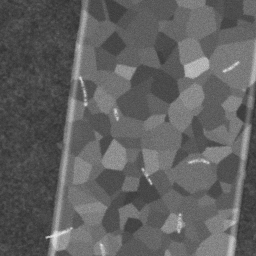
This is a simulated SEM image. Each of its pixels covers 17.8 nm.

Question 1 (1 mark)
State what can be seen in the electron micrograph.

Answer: one or a few lines or trenches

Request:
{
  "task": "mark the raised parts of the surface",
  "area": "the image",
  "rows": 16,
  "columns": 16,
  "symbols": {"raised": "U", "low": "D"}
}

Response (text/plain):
DDDDDUUUUUUUUUUU
DDDDDUUUUUUUUUUU
DDDDDUUUUUUUUUUU
DDDDDUUUUUUUUUUU
DDDDDUUUUUUUUUUU
DDDDDUUUUUUUUUUU
DDDDDUUUUUUUUUUU
DDDDUUUUUUUUUUUU
DDDDUUUUUUUUUUUD
DDDDUUUUUUUUUUUD
DDDDUUUUUUUUUUUD
DDDDUUUUUUUUUUUD
DDDDUUUUUUUUUUUD
DDDDUUUUUUUUUUUD
DDDUUUUUUUUUUUUD
DDDUUUUUUUUUUUDD